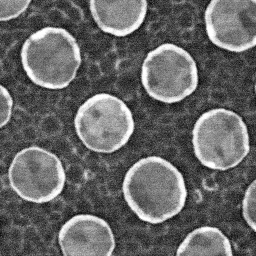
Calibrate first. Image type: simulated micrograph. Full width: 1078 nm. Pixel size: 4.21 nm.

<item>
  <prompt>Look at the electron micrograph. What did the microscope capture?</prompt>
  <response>raised bodies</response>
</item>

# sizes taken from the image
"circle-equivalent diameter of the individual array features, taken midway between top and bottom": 0.241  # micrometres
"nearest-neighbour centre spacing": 0.35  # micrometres